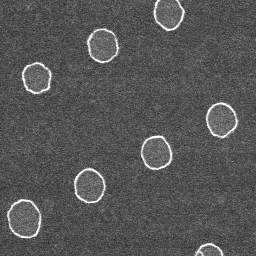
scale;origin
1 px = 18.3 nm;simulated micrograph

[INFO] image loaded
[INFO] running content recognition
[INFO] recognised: raised bodies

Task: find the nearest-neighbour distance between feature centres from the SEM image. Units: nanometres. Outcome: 1330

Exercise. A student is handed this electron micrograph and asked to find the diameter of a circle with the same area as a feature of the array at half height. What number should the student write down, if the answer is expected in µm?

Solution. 0.573